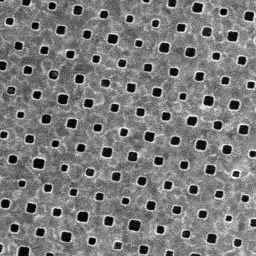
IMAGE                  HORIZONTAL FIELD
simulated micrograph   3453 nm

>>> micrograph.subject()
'a regular array of holes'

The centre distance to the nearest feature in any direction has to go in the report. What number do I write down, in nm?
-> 349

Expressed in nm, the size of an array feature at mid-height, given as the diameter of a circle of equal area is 128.